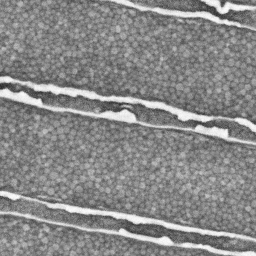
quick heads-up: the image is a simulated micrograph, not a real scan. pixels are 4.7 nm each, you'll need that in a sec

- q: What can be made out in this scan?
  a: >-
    one or a few lines or trenches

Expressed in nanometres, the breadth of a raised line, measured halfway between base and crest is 97.2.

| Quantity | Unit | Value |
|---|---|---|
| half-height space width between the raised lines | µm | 0.44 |